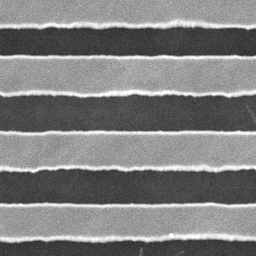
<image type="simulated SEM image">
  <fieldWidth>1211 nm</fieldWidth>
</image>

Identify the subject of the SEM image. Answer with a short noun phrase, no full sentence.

lines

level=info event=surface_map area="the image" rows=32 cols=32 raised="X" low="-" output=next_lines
XXXXXXXXXXXXXXXXXXXXXXXXXXXXXXXX
XXXXXXXXXXXXXXXXXXXXXXXXXXXXXXXX
XXXXXXXXXXXXXXXXXXXXXXXXXXXXXXXX
XXXXXX--X--XX---XX-XX------X--XX
--------------------------------
--------------------------------
--------------------------------
XXXXXXXXXXXXXXXXXXXXXXXXXXXXXXXX
XXXXXXXXXXXXXXXXXXXXXXXXXXXXXXXX
XXXXXXXXXXXXXXXXXXXXXXXXXXXXXXXX
XXXXXXXXXXXXXXXXXXXXXXXXXXXXXXXX
XXXXXXXXXXXXXXXXXXXXXXXXXXXXXXXX
--------------------------------
--------------------------------
--------------------------------
--------------------------------
XXX--XXXXXXXXXXXXXXXXXXXXXXXXXXX
XXXXXXXXXXXXXXXXXXXXXXXXXXXXXXXX
XXXXXXXXXXXXXXXXXXXXXXXXXXXXXXXX
XXXXXXXXXXXXXXXXXXXXXXXXXXXXXXXX
XXXXXXXXXXXXXXXXXXXXXXXXXXXXXXXX
--------------------------------
--------------------------------
--------------------------------
--------------------------------
X--XXXXXX--------------XXXXX---X
XXXXXXXXXXXXXXXXXXXXXXXXXXXXXXXX
XXXXXXXXXXXXXXXXXXXXXXXXXXXXXXXX
XXXXXXXXXXXXXXXXXXXXXXXXXXXXXXXX
XXXXXXXXXXXXXXXXXXXXXXXXXXXXXXXX
--------------------------------
--------------------------------